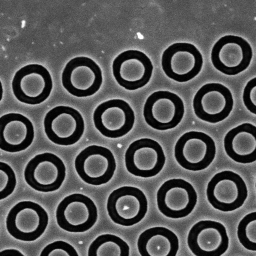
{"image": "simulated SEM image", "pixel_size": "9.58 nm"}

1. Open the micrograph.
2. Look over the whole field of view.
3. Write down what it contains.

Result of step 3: a regular array of ring-shaped grooves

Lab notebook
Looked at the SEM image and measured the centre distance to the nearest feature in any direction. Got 481 nanometers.